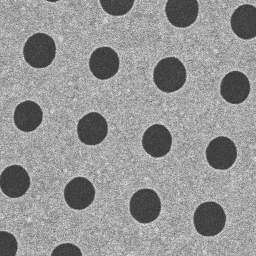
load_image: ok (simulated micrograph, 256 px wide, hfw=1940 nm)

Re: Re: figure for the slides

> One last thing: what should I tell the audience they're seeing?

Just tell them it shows a regular array of holes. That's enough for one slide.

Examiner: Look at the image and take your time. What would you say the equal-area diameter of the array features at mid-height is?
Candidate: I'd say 244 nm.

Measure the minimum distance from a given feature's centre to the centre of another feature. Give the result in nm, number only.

498